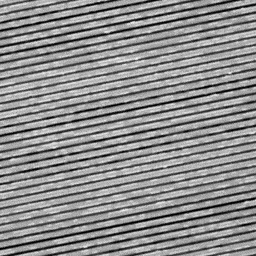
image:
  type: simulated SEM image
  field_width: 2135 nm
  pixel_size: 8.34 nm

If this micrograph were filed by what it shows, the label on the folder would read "parallel lines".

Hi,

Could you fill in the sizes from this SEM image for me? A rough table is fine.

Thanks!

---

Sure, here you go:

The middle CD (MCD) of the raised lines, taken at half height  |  0.044 microns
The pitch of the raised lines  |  66.1 nanometers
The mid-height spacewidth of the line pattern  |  2.7 pixels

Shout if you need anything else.